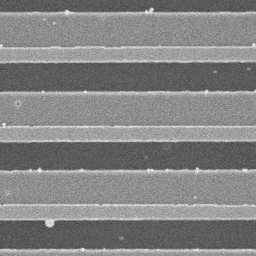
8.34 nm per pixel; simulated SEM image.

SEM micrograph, lines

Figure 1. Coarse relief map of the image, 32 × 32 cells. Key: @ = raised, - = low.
--------------------------------
--------@---------@-------------
@@@@@@@@@@@@@@@@@@@@@@@@@@@@@@@@
@@@@@@@@@@@@@@@@@@@@@@@@@@@@@@@@
@@@@@@@@@@@@@@@@@@@@@@@@@@@@@@@@
@@@@@@@@@@@@@@@@@@@@@@@@@@@@@@@@
@@@@@@@@@@@@@@@@@@@@@@@@@@@@@@@@
@@@@@@@@@@@@@@@@@@@@@@@@@@@@@@@@
--------------------------------
--------------------------------
--------------------------------
-----@----@----@@-@@@-@@-@@@@@@@
@@@@@@@@@@@@@@@@@@@@@@@@@@@@@@@@
@@@@@@@@@@@@@@@@@@@@@@@@@@@@@@@@
@@@@@@@@@@@@@@@@@@@@@@@@@@@@@@@@
@@@@@@@@@@@@@@@@@@@@@@@@@@@@@@@@
@@@@@@@@@@@@@@@@@@@@@@@@@@@@@@@@
@@@@@@@@@@@@@@@@@@@@@@@@@@@@@@@@
--------------------------------
--------------------------------
--------------------------------
@@@@@@@@@@@@@@@@@@@@@@@@@@@@@@@@
@@@@@@@@@@@@@@@@@@@@@@@@@@@@@@@@
@@@@@@@@@@@@@@@@@@@@@@@@@@@@@@@@
@@@@@@@@@@@@@@@@@@@@@@@@@@@@@@@@
@@@@@@@@@@@@@@@@@@@@@@@@@@@@@@@@
@@@@@@@@@@@@@@@@@@@@@@@@@@@@@@@@
-----@@-------------------------
--------------------------------
--------------------------------
--------------------------------
@@@@@@@@@@@@@@@@@@@@@@@@@@@@@@@@